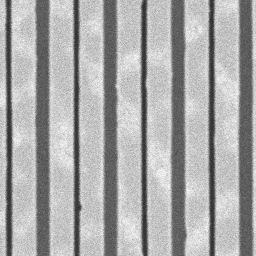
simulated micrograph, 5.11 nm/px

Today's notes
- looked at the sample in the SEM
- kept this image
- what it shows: parallel lines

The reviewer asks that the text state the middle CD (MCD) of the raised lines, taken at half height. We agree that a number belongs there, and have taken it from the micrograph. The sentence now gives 0.125 micrometres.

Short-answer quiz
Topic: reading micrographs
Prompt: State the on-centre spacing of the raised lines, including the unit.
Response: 173 nanometers